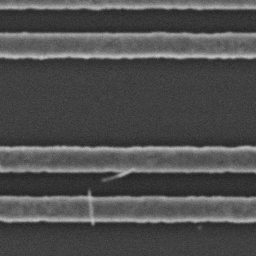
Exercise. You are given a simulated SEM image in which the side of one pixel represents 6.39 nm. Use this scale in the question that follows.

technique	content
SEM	lines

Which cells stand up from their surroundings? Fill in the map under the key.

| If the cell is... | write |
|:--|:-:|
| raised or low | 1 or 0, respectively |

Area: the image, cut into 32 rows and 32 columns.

11111111111111111111111111111111
00000000000000000000000000000000
00000000000000000000000000000000
00000000000000000000000000000000
11111111111111111111111111111111
11111111111111111111111111111111
11111111111111111111111111111111
00000000000000000000000000000000
00000000000000000000000000000000
00000000000000000000000000000000
00000000000000000000000000000000
00000000000000000000000000000000
00000000000000000000000000000000
00000000000000000000000000000000
00000000000000000000000000000000
00000000000000000000000000000000
00000000000000000000000000000000
00000000000000000000000000000000
10111111111010001111101101111111
11111111111111111111111111111111
11111111111111111111111111111111
00000000000000010000000000000000
00000000000000000000000000000000
00000000000000000000000000000000
00000000000000000000000000000000
11111111111111111111111111111111
11111111111111111111111111111111
11111111111111111111111111111111
00000000000000000000000000000000
00000000000000000000000000000000
00000000000000000000000000000000
00000000000000000000000000000000